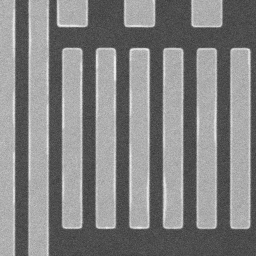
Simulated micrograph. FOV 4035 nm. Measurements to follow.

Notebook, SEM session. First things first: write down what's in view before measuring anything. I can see groups of lines, slits or small figures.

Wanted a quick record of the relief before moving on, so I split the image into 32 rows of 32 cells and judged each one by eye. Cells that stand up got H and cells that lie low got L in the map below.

HHLLHHLHHHHLLLLLHHHLLLLLHHHHLLLL
HHLLHHLHHHHLLLLLHHHLLLLLHHHHLLLL
HHLLHHLHHHHLLLLLHHHLLLLLHHHHLLLL
HHLLHHLLLLLLLLLLLLLLLLLLLLLLLLLL
HHLLHHLLLLLLLLLLLLLLLLLLLLLLLLLL
HHLLHHLLLLLLLLLLLLLLLLLLLLLLLLLL
HHLLHHLLHHLLHHLLHHLLLHHLLHHLLHHL
HHLLHHLLHHLLHHLLHHLLLHHLLHHLLHHL
HHLLHHLLHHLLHHLLHHLLLHHLLHHLLHHL
HHLLHHLLHHLLHHLLHHLLLHHLLHHLLHHL
HHLLHHLLHHLLHHLLHHLLLHHLLHHLLHHL
HHLLHHLLHHLLHHLLHHLLLHHLLHHLLHHL
HHLLHHLLHHLLHHLLHHLLLHHLLHHLLHHL
HHLLHHLLHHLLHHLLHHLLLHHLLHHLLHHL
HHLLHHLLHHLLHHLLHHHLLHHLLHHLLHHL
HHLLHHLLHHLLHHLLHHHLLHHLLHHLLHHL
HHLLHHLLHHLLHHLLHHHLLHHLLHHLLHHL
HHLLHHLLHHLLHHLLHHHLLHHLLHHLLHHL
HHLLHHLLHHLLHHLLHHHLLHHLLHHLLHHL
HHLLHHLLHHLLHHLLHHHLLHHLLHHLLHHL
HHLLHHLLHHLLHHLLHHHLLHHLLHHLLHHL
HHLLHHLLHHLLHHLLHHHLLHHLLHHLLHHL
HHLLHHLLHHLLHHLLHHLLLHHLLHHLLHHL
HHLLHHLLHHLLHHLLHHLLLHHLLHHLLHHL
HHLLHHLLHHLLHHLLHHLLLHHLLHHLLHHL
HHLLHHLLHHLLHHLLHHLLLHHLLHHLLHHL
HHLLHHLLHHLLHHLLHHLLLHHLLHHLLHHL
HHLLHHLLHHLLHHLLHHHLLHHLLHHLLHHL
HHLLHHLLLLLLLLLLLLLLLLLLLLLLLLLL
HHLLHHLLLLLLLLLLLLLLLLLLLLLLLLLL
HHLLHHLLLLLLLLLLLLLLLLLLLLLLLLLL
HHLLHHLLLLLLLLLLLLLLLLLLLLLLLLLL